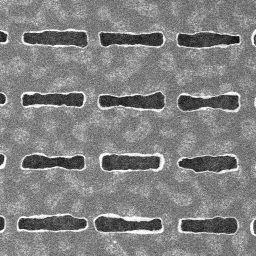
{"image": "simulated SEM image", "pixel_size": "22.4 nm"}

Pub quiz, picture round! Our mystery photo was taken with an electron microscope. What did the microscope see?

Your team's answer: a regular array of holes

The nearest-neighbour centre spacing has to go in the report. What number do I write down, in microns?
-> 1.37